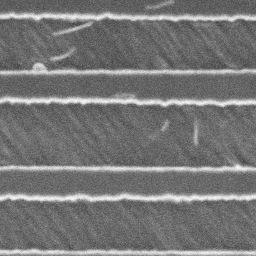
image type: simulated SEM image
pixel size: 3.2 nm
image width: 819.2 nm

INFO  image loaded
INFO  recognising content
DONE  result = lines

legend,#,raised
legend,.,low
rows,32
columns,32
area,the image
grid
################################
################################
............................#...
................................
................................
................................
................................
................................
................................
################################
################################
################################
################################
................................
................................
................................
................................
................................
................................
................................
................................
################################
################################
################################
################################
................................
................................
................................
................................
................................
................................
#########.####.##..###..........